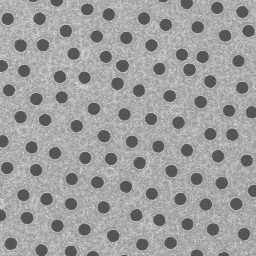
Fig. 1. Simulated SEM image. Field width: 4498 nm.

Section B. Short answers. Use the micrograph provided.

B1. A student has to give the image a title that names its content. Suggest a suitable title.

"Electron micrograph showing a regular array of holes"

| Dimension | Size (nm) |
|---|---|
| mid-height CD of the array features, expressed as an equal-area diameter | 214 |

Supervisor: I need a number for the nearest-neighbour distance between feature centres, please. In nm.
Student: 428